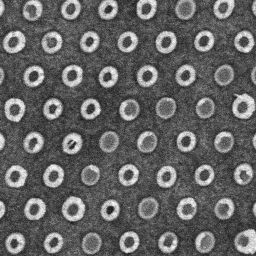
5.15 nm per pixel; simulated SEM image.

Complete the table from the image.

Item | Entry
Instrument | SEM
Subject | a regular array of raised bodies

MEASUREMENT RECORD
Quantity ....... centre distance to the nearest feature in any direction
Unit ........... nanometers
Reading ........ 194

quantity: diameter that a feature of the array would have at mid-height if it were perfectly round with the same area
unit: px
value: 19.7